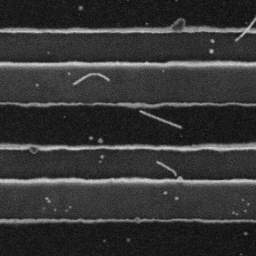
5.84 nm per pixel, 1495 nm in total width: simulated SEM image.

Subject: lines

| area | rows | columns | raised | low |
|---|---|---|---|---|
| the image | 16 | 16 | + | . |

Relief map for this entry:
++++++++++++++++
++++++++++++++++
................
................
................
................
+++++++++.+++++.
++++++++++++++++
++++++++++++++++
................
................
................
................
................
++++++++++++++++
++++++++++++++++